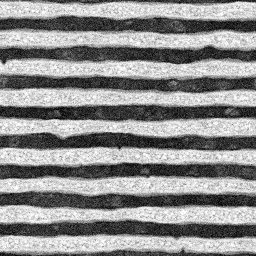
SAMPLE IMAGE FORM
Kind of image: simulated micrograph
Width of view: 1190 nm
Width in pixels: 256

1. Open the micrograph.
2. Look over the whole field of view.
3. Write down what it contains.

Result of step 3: parallel lines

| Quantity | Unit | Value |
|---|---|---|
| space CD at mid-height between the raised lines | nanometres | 68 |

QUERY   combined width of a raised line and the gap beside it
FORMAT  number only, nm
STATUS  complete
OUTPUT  136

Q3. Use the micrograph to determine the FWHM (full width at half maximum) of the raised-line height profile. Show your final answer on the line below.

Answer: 0.068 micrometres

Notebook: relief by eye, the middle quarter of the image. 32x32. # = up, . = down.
################################
################################
################################
................................
................................
................................
#####...###.....................
#########################.######
################################
################################
................................
................................
................................
................................
#############.#####...#.########
################################
################################
###...............#############.
................................
................................
................................
########################........
################################
################################
##############.#################
................................
................................
................................
..............###########.......
################################
################################
################################